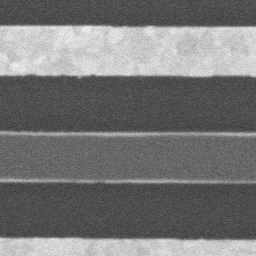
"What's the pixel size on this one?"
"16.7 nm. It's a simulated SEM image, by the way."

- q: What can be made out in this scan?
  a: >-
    lines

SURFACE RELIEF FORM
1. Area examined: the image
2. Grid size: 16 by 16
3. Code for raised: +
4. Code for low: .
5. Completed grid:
................
................
++++++++++++++++
++++++++++++++++
++++++++++++++++
................
................
................
++++++++++++++++
++++++++++++++++
++++++++++++++++
................
................
................
................
++++++++++++++++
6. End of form